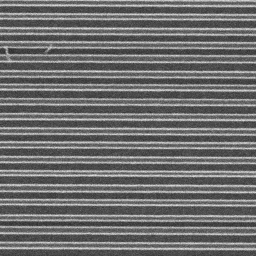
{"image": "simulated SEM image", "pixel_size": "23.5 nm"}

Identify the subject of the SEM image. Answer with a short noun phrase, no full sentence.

parallel lines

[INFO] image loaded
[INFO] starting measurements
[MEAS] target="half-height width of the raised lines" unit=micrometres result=0.132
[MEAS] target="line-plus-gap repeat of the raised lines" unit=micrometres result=0.337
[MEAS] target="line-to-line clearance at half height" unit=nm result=197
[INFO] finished